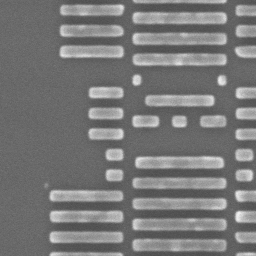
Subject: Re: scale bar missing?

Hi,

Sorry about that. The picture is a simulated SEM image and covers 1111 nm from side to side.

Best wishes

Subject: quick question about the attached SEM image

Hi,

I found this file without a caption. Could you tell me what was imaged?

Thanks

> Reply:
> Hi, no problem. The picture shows wiring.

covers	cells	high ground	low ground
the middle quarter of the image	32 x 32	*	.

................................
................................
................................
.................**.............
.................**.............
................................
.......********.................
.......********.................
...........***.......***********
.....................***********
................................
.......*******..................
......*********.................
.......*******...******....***..
.................******....****.
..................*****.....**..
.......*******..................
......*********.................
.......*******..................
................................
................................
...........***..................
...........****.................
...........****...**************
..................**************
..................**************
................................
...........****.................
...........****.....**..**......
.................***************
.................***************
................................